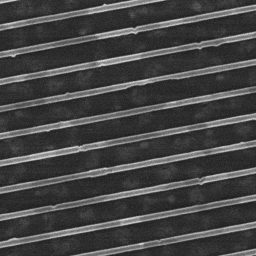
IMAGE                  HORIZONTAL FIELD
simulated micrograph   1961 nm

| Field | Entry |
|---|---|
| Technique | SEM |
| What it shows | parallel lines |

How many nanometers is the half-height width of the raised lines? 40.5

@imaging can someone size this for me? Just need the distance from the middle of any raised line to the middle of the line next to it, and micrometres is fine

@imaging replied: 0.205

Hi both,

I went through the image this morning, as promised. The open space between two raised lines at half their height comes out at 21.3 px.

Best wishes